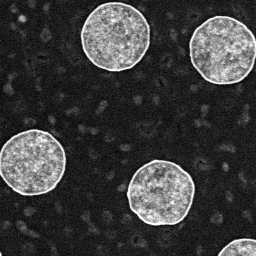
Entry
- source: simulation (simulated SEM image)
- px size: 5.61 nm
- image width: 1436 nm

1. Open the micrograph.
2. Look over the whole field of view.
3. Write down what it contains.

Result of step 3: raised bodies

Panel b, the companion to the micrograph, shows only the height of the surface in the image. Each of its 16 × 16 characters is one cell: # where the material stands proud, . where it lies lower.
......##........
.....####....##.
.....####...####
......###...####
............###.
................
................
................
.##.............
####............
####.....##.....
.##.....####....
........####....
.........##.....
................
..............##